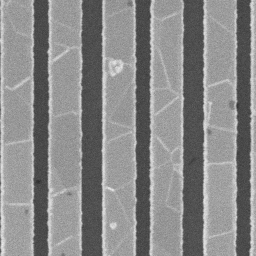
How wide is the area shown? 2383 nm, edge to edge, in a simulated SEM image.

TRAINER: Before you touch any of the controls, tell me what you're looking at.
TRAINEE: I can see lines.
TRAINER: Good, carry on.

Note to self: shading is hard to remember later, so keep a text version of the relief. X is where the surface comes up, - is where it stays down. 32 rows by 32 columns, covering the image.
XXXX--XXXX---XXXX--XXXX--XXXX--X
XXXX--XXXX---XXXX--XXXX--XXXXX-X
XXXX--XXXX---XXXX--XXXX--XXXX--X
XXXX--XXXX---XXXX--XXXX---XXX--X
XXXX--XXXX---XXXX--XXXX--XXXX--X
XXXX--XXXX---XXXX--XXXX---XXXX-X
XXXX--XXXX---XXXX--XXXX--XXXX--X
XXXX--XXXX---XXXX--XXXX--XXXX--X
XXXX--XXXX---XXXX--XXXX--XXXX--X
XXXX--XXXX---XXXX--XXXX--XXXX--X
XXXX--XXXX---XXXX--XXXX--XXXX--X
XXXX--XXXX---XXXX--XXXX---XXX--X
XXXX--XXXX---XXXX--XXXX---XXX--X
XXXX--XXXX---XXXX--XXXX--XXXX--X
XXXX--XXXX---XXXX--XXXX---XXXX-X
XXXX--XXXX---XXXX--XXXX--XXXXX-X
XXXX--XXXX---XXXX--XXXX---XXXX-X
XXXX--XXXX---XXXX--XXXX---XXX--X
XXXX--XXXX---XXXX--XXXX--XXXX--X
XXXX--XXXX---XXXX--XXXX--XXXX--X
XXXX--XXXX---XXXX--XXXX--XXXX--X
XXXX--XXXX---XXXX--XXXX--XXXX--X
XXXX--XXXX---XXXX--XXXX---XXX--X
XXXX--XXXX---XXXX--XXXX--XXXXX-X
XXXX--XXXX---XXXX--XXXX--XXXX--X
XXXX--XXXX---XXXX--XXXX--XXXX--X
XXXX--XXXX---XXXX--XXXX--XXXX--X
XXXX--XXXX---XXXX--XXXX--XXXX--X
XXXX--XXXX---XXXX--XXXX--XXXX--X
XXXX--XXXX---XXXX--XXXX--XXXX--X
XXXX--XXXX---XXXX--XXXX--XXXX--X
XXXX--XXXX---XXXX--XXXX--XXXX--X